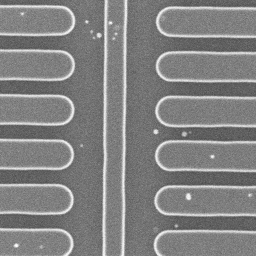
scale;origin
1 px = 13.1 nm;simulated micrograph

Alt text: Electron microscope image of groups of lines, slits or small figures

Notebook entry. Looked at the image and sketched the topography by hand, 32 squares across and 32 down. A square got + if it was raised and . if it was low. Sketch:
.............+++................
+++++++++....+++....++++++++++++
+++++++++....+++....++++++++++++
+++++++++....+++....++++++++++++
.............+++.......+++++++++
.............+++................
++++++++.....+++................
+++++++++....+++....++++++++++++
+++++++++....+++....++++++++++++
+++++++++....+++....++++++++++++
.............+++................
.............+++................
+++++++++....+++....++++++++++++
+++++++++....+++....++++++++++++
+++++++++....+++....++++++++++++
+.++++++.....+++.....+++++++++++
.............+++................
+............+++................
+++++++++....+++....++++++++++++
+++++++++....+++...+++++++++++++
+++++++++....+++....++++++++++++
.............++.................
.............++.................
++++++++.....++.....++++++++++++
+++++++++....++.....++++++++++++
+++++++++....+++...+++++++++++++
++++++++.....+++....++++++++++++
.............++.................
.............++.................
+++++++++....++.....++++++++++++
+++++++++....++....+++++++++++++
+++++++++....++.....++++++++++++